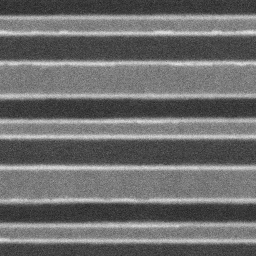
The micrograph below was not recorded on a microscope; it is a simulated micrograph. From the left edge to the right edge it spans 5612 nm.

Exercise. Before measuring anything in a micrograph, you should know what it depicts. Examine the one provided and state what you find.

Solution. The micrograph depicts lines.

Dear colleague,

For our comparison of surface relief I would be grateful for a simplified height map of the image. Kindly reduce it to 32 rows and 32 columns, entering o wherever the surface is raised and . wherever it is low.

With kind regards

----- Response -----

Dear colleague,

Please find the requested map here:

................................
................................
oooooooooooooooooooooooooooooooo
oooooooooooooooooooooooooooooooo
................................
................................
................................
................................
oooooooooooooooooooooooooooooooo
oooooooooooooooooooooooooooooooo
oooooooooooooooooooooooooooooooo
oooooooooooooooooooooooooooooooo
................................
................................
................................
oooooooooooooooooooooooooooooooo
oooooooooooooooooooooooooooooooo
................................
................................
................................
................................
oooooooooooooooooooooooooooooooo
oooooooooooooooooooooooooooooooo
oooooooooooooooooooooooooooooooo
oooooooooooooooooooooooooooooooo
................................
................................
................................
oooooooooooooooooooooooooooooooo
oooooooooooooooooooooooooooooooo
................................
................................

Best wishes